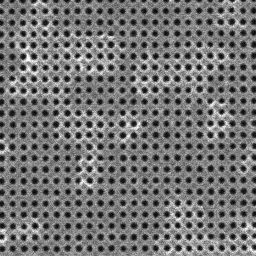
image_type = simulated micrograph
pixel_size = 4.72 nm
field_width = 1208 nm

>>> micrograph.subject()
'a regular array of holes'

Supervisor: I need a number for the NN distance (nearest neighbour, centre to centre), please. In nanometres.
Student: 51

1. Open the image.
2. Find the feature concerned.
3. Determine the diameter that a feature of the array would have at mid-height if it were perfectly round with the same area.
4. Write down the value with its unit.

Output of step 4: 32 nanometers